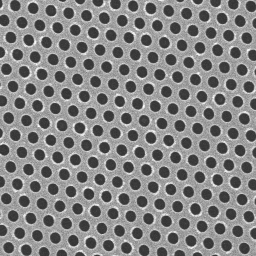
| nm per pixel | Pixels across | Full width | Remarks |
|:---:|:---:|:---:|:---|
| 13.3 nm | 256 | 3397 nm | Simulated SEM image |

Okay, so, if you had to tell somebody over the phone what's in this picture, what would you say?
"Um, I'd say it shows a regular array of holes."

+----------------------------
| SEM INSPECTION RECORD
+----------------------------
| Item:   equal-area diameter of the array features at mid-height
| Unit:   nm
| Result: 146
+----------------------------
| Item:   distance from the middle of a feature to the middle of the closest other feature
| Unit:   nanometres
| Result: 237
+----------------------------